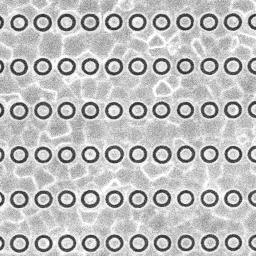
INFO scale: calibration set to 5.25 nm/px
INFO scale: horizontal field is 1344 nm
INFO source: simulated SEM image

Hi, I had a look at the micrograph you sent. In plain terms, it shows a regular array of ring-shaped grooves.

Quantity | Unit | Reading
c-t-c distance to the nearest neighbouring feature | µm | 0.122